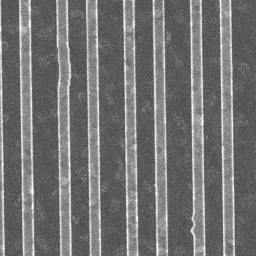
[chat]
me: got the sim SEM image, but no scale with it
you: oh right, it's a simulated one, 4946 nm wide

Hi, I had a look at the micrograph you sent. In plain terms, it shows parallel lines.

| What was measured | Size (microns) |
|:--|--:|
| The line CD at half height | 0.203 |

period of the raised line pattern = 0.646 microns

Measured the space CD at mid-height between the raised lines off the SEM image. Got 389 nanometres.